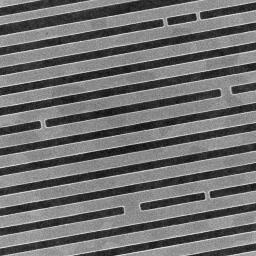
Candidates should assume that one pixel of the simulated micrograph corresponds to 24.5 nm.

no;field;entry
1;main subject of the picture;parallel lines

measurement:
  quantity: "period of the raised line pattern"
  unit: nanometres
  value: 486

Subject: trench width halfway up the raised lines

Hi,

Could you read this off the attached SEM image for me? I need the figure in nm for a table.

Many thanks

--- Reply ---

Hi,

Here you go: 205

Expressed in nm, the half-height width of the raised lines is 281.